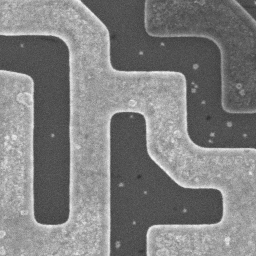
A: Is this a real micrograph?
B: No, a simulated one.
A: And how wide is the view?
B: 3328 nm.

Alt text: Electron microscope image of wiring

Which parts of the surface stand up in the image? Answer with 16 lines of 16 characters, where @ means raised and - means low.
@@@@@----@@@@@@-
@@@@@@---@@@@@@@
----@@@------@@@
----@@@-------@@
@---@@@@------@@
@@--@@@@@@@@--@@
@@--@@@@@@@@--@@
@@--@@@--@@@----
@@--@@@--@@@----
@@--@@@--@@@@@@@
@@--@@@---@@@@@@
@@--@@@----@@@@@
@@--@@@-------@@
@@--@@@-------@@
@@@@@@@--@@@@@@@
@@@@@@@--@@@@@@@